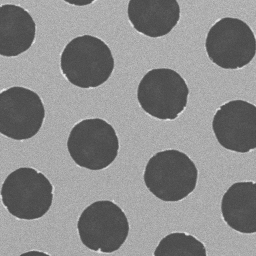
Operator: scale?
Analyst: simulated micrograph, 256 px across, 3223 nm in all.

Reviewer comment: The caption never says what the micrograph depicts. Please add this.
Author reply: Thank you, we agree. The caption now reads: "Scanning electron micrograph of holes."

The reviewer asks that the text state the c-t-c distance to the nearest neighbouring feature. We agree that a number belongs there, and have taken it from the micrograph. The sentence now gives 82.4 pixels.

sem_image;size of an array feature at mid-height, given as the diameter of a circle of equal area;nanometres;648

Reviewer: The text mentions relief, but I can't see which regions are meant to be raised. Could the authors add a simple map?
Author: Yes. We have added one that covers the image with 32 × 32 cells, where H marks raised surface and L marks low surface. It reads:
HHHHHHHHHLLHHHHHLLLLLLHHHHHHHHHH
LLLHHHHHHHHHHHHHLLLLLLHHHHHHHHHH
LLLLHHHHHHHHHHHHLLLLLLHHHHHHLLHH
LLLLHHHHHHHHHHHHHLLLLLHHHHLLLLLH
LLLLHHHHHHLHHHHHHHLLHHHHHHLLLLLL
LLLLHHHHLLLLLHHHHHHHHHHHHHLLLLLL
LLLHHHHHLLLLLLHHHHHHHHHHHHLLLLLL
HHHHHHHHLLLLLLHHHHHHHHHHHHLLLLLH
HHHHHHHHLLLLLLHHHHHHHHHHHHHHLLHH
HHHHHHHHLLLLLLHHHHLLLLLHHHHHHHHH
HHHHHHHHHLLLLHHHHLLLLLLHHHHHHHHH
LLLLHHHHHHHHHHHHHLLLLLLLHHHHHHHH
LLLLLHHHHHHHHHHHHLLLLLLHHHHHHHHH
LLLLLHHHHHHHHHHHHHLLLLLHHHHHLLLL
LLLLLLHHHHHHHHHHHHHLLLHHHHHLLLLL
LLLLLHHHHHLLLLHHHHHHHHHHHHHLLLLL
LLLLLHHHHLLLLLHHHHHHHHHHHHHLLLLL
HHHHHHHHLLLLLLLHHHHHHHHHHHHLLLLL
HHHHHHHHLLLLLLLHHHHHHHHHHHHHLLLL
HHHHHHHHHLLLLLLHHHHLLLLHHHHHHHHH
HHHHHHHHHHLLLLHHHHLLLLLLHHHHHHHH
HHLLLHHHHHHHHHHHHHLLLLLLLHHHHHHH
HLLLLLHHHHHHHHHHHHLLLLLLLHHHHHHH
LLLLLLLHHHHHHHHHHHHLLLLLHHHHHLLL
LLLLLLLHHHHHHHHHHHHLLLLHHHHHLLLL
HLLLLLHHHHHLLLHHHHHHHHHHHHHHLLLL
HLLLLLHHHHLLLLLHHHHHHHHHHHHHLLLL
HHHHHHHHHHLLLLLLHHHHHHHHHHHHLLLL
HHHHHHHHHHLLLLLLHHHHHHHHHHHHHLLL
HHHHHHHHHHLLLLLLHHHHHLLLHHHHHHHH
HHHHHHHHHHLLLLLHHHHHLLLLLHHHHHHH
HHHLLHHHHHHHHLHHHHHLLLLLLLHHHHHH